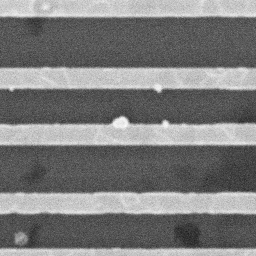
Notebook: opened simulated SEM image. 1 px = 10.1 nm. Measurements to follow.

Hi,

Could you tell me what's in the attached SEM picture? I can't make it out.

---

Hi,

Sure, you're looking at lines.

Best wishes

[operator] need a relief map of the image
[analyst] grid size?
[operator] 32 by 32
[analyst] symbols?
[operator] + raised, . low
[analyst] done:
++++++++++++++++++++++++++++++++
++++++++++++++++++++++++++++++++
................................
................................
................................
................................
................................
................................
................................
++++++++++++++++++++++++++++++++
++++++++++++++++++++++++++++++++
................................
................................
................................
................................
..............++....+...........
++++++++++++++++++++++++++++++++
++++++++++++++++++++++++++++++++
................................
................................
................................
................................
................................
................................
++++++++++++++++++++++++++++++++
++++++++++++++++++++++++++++++++
+++++.++++++++.+++++++++.+++++++
................................
................................
..+.............................
................................
++++++++++++++++++++++++++++++++